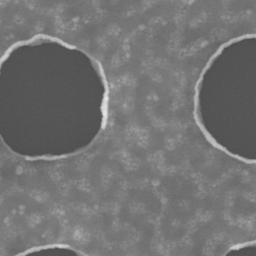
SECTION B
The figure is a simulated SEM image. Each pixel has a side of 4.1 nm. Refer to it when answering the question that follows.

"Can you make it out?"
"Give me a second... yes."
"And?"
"holes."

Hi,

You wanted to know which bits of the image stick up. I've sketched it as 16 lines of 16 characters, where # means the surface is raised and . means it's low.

################
################
###############.
.....#########..
......#######...
......######....
......######....
......#######...
......#######...
#....#########..
################
################
################
################
################
###.###########.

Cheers